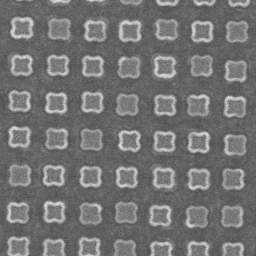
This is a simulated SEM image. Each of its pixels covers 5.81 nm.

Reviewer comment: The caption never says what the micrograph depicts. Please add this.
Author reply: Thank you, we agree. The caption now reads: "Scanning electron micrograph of a regular array of raised bodies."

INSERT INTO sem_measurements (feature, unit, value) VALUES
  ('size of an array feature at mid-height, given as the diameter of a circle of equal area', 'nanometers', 129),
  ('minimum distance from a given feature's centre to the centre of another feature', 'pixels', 35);